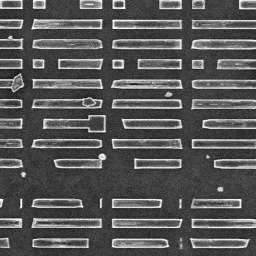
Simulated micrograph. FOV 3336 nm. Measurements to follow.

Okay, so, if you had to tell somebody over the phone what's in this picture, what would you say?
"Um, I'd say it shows wiring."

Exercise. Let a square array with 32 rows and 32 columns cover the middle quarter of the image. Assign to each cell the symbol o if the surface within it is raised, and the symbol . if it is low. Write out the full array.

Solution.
ooooooooo...ooo....oooooooooo...
................................
................................
................................
ooooooooo....oooooooooooooooo...
ooooooooo...ooooooooooooooooo...
................................
..........................o.....
................................
ooooooooo...ooooooooooooooooo...
ooooooooo...ooooooooooooooooo...
................................
................................
......oooo......................
oooooooooo.....oooooooooooooo...
oooooooooo.....oooooooooooooo...
......oooo......................
................................
................................
ooooooooo...ooooooooooooooooo...
ooooooooo...ooooooooooooooooo...
................................
................................
.........o......................
ooooooooo.........ooooooooooo...
ooooooooo.........ooooooooooo...
................................
................................
................................
................................
................................
................................